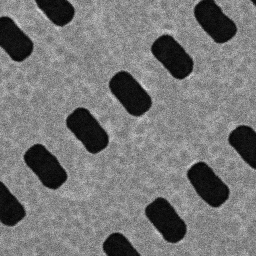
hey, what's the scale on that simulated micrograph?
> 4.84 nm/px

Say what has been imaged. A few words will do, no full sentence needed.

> holes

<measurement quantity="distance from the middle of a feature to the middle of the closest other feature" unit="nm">270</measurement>